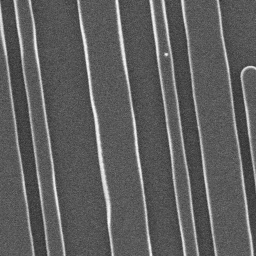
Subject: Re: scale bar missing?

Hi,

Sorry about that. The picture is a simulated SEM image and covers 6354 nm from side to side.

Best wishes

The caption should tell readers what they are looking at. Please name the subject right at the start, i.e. groups of lines, slits or small figures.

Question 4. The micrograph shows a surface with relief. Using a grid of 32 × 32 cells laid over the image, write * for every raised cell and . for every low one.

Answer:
..**......*****....*...****.....
..**......*****....**..****.....
..**......*****....**..*****....
..**......*****....**..*****....
..**......*****....**..*****....
*..*.......****.....*..*****....
*..**......****.....*...****....
*..**......*****....**..****....
*..**......*****....**..*****..*
*..**......*****....**..*****.**
*..**......*****....**..*****.**
*..**......*****....**..*****.**
**.***.....*****....**..*****..*
**..**......****.....*..*****..*
**..**......*****....*...****..*
**..**......*****....**..****..*
**..**......*****....**..*****.*
**..**......*****....**..*****.*
**..**......*****....**..*****.*
***.**......*****....**..*****.*
***..**......****.....*..*****..
***..**......*****....*...****..
***..**......*****....**..****..
***..**......*****....**..*****.
***..**......*****....**..*****.
***..**......*****....**..*****.
****.**.......****....**..*****.
****..*.......****....**..*****.
****..**......****.....*...****.
****..**......*****....*...****.
****..**......*****....**..****.
****..**......*****....**..*****